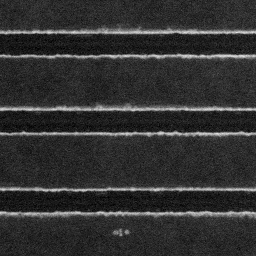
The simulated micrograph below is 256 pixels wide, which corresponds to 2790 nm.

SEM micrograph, lines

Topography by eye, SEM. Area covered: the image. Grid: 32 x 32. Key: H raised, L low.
HHHHHHHHHHHHHHHHHHHHHHHHHHHHHHHH
HHHHHHHHHHHHHHHHHHHHHHHHHHHHHHHH
HHHHHHHHHHHHHHHHHHHHHHHHHHHHHHHH
HHHHHHHHHHHHHHHHHHHHHHHHHHHHHHHH
LLLLLLLLLLLLLLLLLLLLLLLLLLLLLLLL
LLLLLLLLLLLLLLLLLLLLLLLLLLLLLLLL
LLLLLLLLLLLLLLLLLLLLLLLLLLLLLLLL
HHHHHHHHHHHHHHHHHHHHHHHHHHHHHHHH
HHHHHHHHHHHHHHHHHHHHHHHHHHHHHHHH
HHHHHHHHHHHHHHHHHHHHHHHHHHHHHHHH
HHHHHHHHHHHHHHHHHHHHHHHHHHHHHHHH
HHHHHHHHHHHHHHHHHHHHHHHHHHHHHHHH
HHHHHHHHHHHHHHHHHHHHHHHHHHHHHHHH
HHHHHHHHHHHHHHHHHHHHHHHHHHHHHHHH
LLLLLLLLLLLLLLLLLLLLLLLLLLLLLLLL
LLLLLLLLLLLLLLLLLLLLLLLLLLLLLLLL
LLLLLLLLLLLLLLLLLLLLLLLLLLLLLLLL
HHHHHHHHHHHHHHHHHHHHHHHHHHHHHHHH
HHHHHHHHHHHHHHHHHHHHHHHHHHHHHHHH
HHHHHHHHHHHHHHHHHHHHHHHHHHHHHHHH
HHHHHHHHHHHHHHHHHHHHHHHHHHHHHHHH
HHHHHHHHHHHHHHHHHHHHHHHHHHHHHHHH
HHHHHHHHHHHHHHHHHHHHHHHHHHHHHHHH
HHHHHHHHHHHHHHHHHHHHHHHHHHHHHHHH
LLLLLLLLLLLLLLLLLLLLLLLLLLLLLLLL
LLLLLLLLLLLLLLLLLLLLLLLLLLLLLLLL
LLLLLLLLLLLLLLLLLLLLLLLLLLLLLLLL
HHHHHHHHHHHHHHHHHHHHHHHHHHHHHHHH
HHHHHHHHHHHHHHHHHHHHHHHHHHHHHHHH
HHHHHHHHHHHHHHHHHHHHHHHHHHHHHHHH
HHHHHHHHHHHHHHHHHHHHHHHHHHHHHHHH
HHHHHHHHHHHHHHHHHHHHHHHHHHHHHHHH